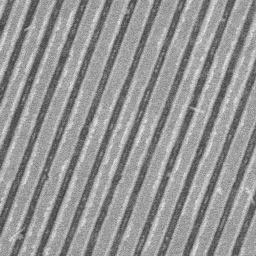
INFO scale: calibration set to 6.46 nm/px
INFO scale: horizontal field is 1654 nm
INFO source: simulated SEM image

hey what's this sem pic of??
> parallel lines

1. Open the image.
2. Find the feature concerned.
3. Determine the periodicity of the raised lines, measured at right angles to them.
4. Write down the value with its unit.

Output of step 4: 148 nm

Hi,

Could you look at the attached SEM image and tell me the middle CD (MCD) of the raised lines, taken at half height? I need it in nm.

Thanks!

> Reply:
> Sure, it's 88.5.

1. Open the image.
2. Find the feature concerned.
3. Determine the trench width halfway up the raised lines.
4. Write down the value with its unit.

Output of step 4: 8.78 pixels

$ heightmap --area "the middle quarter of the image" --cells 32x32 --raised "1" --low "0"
11110011110001110001110001110001
11100011110011110011110001110001
11100011100011110011110011110011
11100111100011100011100011100011
11000111100111100111100111100111
11000111000111000111000111000111
11001111001111001111001111000111
10001110001110001111001111001111
10011110011110001110001110001111
00011110011110011110001110001110
00011100011100011100011110011110
00111100111100011100011100011100
00111100111100111100111100111100
00111000111000111000111000111100
01111001111001111001111000111000
01110001111001111001111001111000
11110011110001110001110001111001
11110011110011110011110001110001
11100011100011110011110011110011
11100011100011100011100011100011
11100111100111100111100011100011
11000111000111000111000111100111
11000111000111000111000111000111
10001111001111001111001111001111
10001110001110001110001111001111
10011110011110001110001110001110
00011100011110011110011110011110
00111100011100011100011110011110
00111100111100011100011100011100
00111000111100111100111100111100
01111000111000111000111000111000
01111001111001111001111001111000